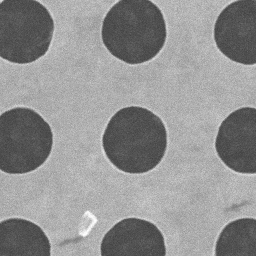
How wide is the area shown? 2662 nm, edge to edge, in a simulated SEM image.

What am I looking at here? holes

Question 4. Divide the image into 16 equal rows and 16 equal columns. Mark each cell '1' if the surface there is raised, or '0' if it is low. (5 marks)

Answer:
0001111000111100
0001110000111000
0001110000111000
0001111000111100
1111111111111111
1111111111111111
1111111111111111
0001111000111100
0001110000111100
0001111000111100
0011111000111100
1111111111111111
1111111111111111
1111111111111111
0001111000111100
0001110000111000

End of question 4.